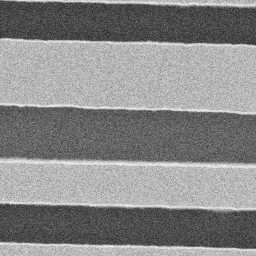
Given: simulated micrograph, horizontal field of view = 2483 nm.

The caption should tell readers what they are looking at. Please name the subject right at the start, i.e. lines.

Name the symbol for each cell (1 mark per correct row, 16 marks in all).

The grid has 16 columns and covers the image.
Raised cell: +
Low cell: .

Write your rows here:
................
................
+...............
++++++++++++++++
++++++++++++++++
++++++++++++++++
++++++++++++++++
................
................
................
++++++++++++++++
++++++++++++++++
++++++++++++++++
................
................
+++++++++++++...